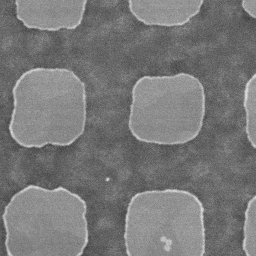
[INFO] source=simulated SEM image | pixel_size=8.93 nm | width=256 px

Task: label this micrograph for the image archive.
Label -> raised bodies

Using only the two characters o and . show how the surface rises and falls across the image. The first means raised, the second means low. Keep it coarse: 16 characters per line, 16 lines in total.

.oooo...oooo...o
..ooo....oo.....
................
................
..oo............
.oooo...ooooo..o
.oooo...ooooo..o
.oooo...ooooo..o
.oooo....ooo....
................
................
................
.oooo...oooo....
ooooo...ooooo..o
ooooo...ooooo..o
ooooo...ooooo..o